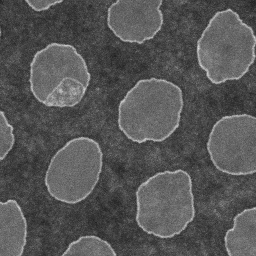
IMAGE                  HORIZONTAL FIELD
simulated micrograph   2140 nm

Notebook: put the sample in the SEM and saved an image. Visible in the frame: raised bodies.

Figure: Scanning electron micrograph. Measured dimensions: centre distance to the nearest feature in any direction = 0.8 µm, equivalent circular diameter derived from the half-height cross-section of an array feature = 507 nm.